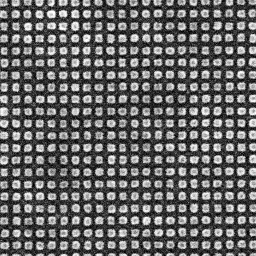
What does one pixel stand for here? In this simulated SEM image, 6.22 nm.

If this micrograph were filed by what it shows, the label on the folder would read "a regular array of raised bodies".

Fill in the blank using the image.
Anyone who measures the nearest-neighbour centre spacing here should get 0.0715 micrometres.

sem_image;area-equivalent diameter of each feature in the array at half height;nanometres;43.8